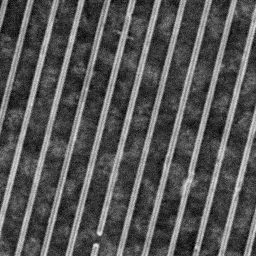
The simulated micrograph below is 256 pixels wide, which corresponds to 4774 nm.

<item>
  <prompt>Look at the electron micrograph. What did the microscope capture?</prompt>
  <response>parallel lines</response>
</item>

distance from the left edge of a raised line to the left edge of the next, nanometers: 460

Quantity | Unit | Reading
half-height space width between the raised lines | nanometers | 382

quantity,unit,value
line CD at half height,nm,67.8